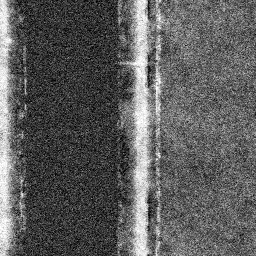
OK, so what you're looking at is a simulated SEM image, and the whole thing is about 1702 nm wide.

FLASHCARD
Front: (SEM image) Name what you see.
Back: one or a few lines or trenches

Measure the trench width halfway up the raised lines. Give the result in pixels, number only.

138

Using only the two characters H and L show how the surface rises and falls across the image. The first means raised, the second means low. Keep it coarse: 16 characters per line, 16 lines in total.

LLLLLLLLLHHHHHHH
LLLLLLLLLHHHHHHH
LLLLLLLLLHHHHHHH
LLLLLLLLLHHHHHHH
LLLLLLLLLHHHHHHH
LLLLLLLLLHHHHHHH
LLLLLLLLLHHHHHHH
LLLLLLLLLHHHHHHH
LLLLLLLLLHHHHHHH
LLLLLLLLLHHHHHHH
LLLLLLLLLHHHHHHH
LLLLLLLLLHHHHHHH
LLLLLLLLLHHHHHHH
LLLLLLLLLHHHHHHH
LLLLLLLLLHHHHHHH
LLLLLLLLLHHHHHHH